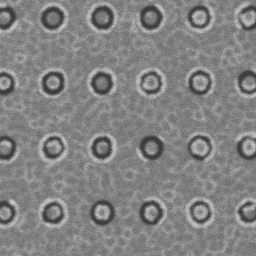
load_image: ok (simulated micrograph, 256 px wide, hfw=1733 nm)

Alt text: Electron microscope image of a regular array of ring-shaped grooves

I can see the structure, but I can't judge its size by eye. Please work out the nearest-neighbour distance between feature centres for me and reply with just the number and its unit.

0.326 µm